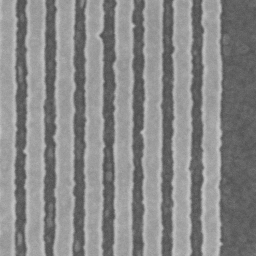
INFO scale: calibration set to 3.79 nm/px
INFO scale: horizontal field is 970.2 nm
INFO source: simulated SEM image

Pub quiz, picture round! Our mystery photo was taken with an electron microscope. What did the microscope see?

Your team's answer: parallel lines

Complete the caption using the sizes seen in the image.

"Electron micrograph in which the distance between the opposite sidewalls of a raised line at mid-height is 0.0639 um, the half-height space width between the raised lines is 45.9 nm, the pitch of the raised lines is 111 nanometres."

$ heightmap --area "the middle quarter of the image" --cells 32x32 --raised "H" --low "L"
HHLLLLHHHHLLLHHHHLLLHHHHLLLLHHHH
HHHLLLHHHLLLLHHHHLLLHHHHLLLLHHHH
HHLLLHHHHLLLLHHHHLLLHHHHHLLLHHHH
HHLLLLHHHLLLLHHHHLLLHHHHLLLLHHHH
HHLLLHHHHHLLLHHHHLLLHHHHLLLLHHHH
HHHLLHHHHHLLLHHHHLLLHHHHLLLHHHHL
HHHLLHHHHHLLLHHHHLLLHHHHLLLHHHHL
HHLLLHHHHLLLLHHHHLLLHHHHLLLHHHHH
HHLLLLHHHLLLLHHHHLLLHHHHLLLHHHHH
HHLLLLHHHLLLLHHHHLLLHHHHLLLHHHHH
HHLLLLHHHHLLLHHHHLLLHHHHLLLLHHHH
HHLLLLHHHLLLLHHHHLLLHHHHLLLLHHHL
HHLLLLHHHLLLLHHHHLLLHHHHLLLLHHHL
HHLLLLHHHHLLLHHHHLLLHHHHHLLLHHHH
HHLLLLHHHHLLLHHHHLLLHHHHLLLHHHHH
HHLLLLHHHHLLLHHHHLLLHHHHLLLLHHHH
HHLLLLHHHHLLLHHHHLLLHHHHLLLLHHHH
HHLLLLHHHLLLLHHHHLLLHHHHLLLLHHHH
HHLLLHHHHHLLLHHHHLLLHHHHLLLHHHHH
HHLLLLHHHHLLLHHHHLLLHHHHLLLHHHHH
HHLLLLHHHHLLLHHHHLLLHHHHLLLHHHHH
HHLLLLHHHHLLLHHHHLLLHHHHLLLHHHHL
HHLLLHHHHHLLLHHHHLLLHHHHLLLLHHHL
HHLLLHHHHHLLLHHHHLLLHHHHLLLHHHHL
HHLLLHHHHHLLLHHHHLLLHHHHLLLLHHHL
HHLLLHHHHLLLLHHHHLLLHHHHLLLLHHHL
HHLLLHHHHHLLLHHHHLLLHHHHLLLLHHHL
HHLLLHHHHHLLLHHHHLLLHHHHLLLLHHHL
HHLLLHHHHLLLLHHHHLLLHHHHLLLLHHHL
HHLLLHHHHHLLLHHHHLLLHHHHLLLHHHHH
HHLLLLHHHHLLLHHHHLLLHHHHLLLLHHHH
HHLLLHHHHHLLLHHHHLLLHHHHLLLHHHHL